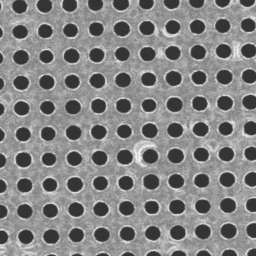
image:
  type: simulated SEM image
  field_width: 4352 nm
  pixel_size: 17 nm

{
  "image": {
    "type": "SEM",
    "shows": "a regular array of holes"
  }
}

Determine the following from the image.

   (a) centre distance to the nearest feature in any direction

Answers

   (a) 429 nm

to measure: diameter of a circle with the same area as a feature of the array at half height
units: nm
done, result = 260